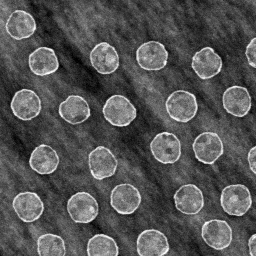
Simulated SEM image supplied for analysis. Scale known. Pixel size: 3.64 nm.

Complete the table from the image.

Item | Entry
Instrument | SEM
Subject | a regular array of raised bodies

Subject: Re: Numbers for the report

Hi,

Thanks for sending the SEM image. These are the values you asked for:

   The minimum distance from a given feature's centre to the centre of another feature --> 162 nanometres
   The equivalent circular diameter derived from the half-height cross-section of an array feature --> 107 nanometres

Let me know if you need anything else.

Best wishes